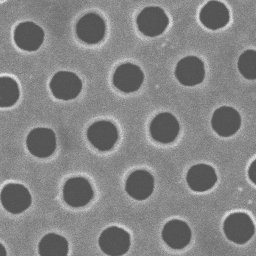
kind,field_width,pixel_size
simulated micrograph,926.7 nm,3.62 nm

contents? a regular array of holes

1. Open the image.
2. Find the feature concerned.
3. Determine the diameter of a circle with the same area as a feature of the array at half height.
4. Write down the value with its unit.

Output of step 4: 109 nanometres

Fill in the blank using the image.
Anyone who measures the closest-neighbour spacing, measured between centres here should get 223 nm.